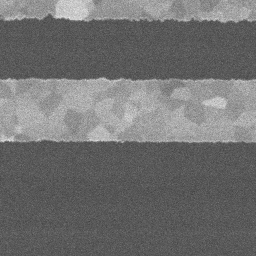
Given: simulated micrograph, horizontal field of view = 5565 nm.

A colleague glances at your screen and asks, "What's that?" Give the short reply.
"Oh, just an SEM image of one or a few lines or trenches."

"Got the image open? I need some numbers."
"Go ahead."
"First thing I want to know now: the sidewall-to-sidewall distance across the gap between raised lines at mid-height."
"1320 nm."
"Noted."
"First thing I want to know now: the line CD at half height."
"1330 nm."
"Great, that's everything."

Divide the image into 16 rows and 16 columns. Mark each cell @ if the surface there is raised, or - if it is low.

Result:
@@@@@@@@@@@@@@@@
----------------
----------------
----------------
----------------
@@@@@@@@@@@@@@@@
@@@@@@@@@@@@@@@@
@@@@@@@@@@@@@@@@
@@@@@@@@@@@@@@@@
----------------
----------------
----------------
----------------
----------------
----------------
----------------